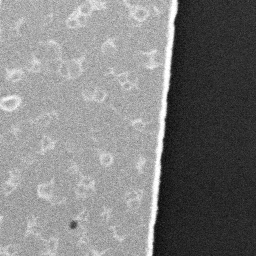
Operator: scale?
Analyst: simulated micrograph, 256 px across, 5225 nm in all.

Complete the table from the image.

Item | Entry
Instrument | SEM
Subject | one or a few lines or trenches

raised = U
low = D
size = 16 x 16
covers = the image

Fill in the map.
UUUUUUUUUUUDDDDD
UUUUUUUUUUUDDDDD
UUUUUUUUUUUDDDDD
UUUUUUUUUUUDDDDD
UUUUUUUUUUDDDDDD
UUUUUUUUUUDDDDDD
UUUUUUUUUUDDDDDD
UUUUUUUUUUDDDDDD
UUUUUUUUUUDDDDDD
UUUUUUUUUUDDDDDD
UUUUUUUUUUDDDDDD
UUUUUUUUUUDDDDDD
UUUUUUUUUUDDDDDD
UUUUUUUUUUDDDDDD
UUUUUUUUUDDDDDDD
UUUUUUUUUDDDDDDD